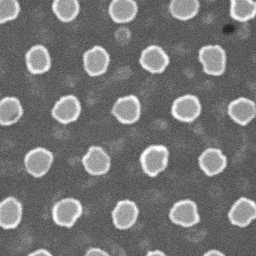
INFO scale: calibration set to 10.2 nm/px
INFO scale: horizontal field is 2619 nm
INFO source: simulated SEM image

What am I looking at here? a regular array of raised bodies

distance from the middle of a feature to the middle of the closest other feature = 586 nm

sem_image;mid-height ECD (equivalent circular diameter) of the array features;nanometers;266